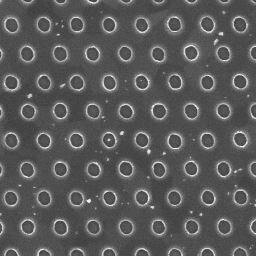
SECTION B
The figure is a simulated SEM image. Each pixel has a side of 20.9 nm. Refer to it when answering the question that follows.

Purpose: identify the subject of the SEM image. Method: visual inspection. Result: a regular array of holes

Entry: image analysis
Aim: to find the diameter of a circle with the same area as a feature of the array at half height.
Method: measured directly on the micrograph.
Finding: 275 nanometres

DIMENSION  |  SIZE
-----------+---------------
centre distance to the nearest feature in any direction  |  676 nanometers